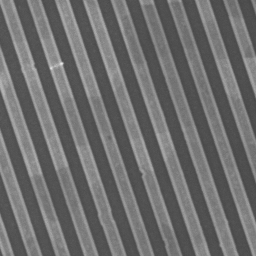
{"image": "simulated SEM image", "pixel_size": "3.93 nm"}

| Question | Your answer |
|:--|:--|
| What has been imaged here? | parallel lines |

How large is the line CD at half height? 46.7 nm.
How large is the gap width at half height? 60.6 nm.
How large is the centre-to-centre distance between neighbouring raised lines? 0.105 um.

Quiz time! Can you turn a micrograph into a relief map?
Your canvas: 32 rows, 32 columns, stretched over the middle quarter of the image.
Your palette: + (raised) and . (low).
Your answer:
...++++....+++...+++.....++.....
....+++....+++....+++....+++....
....+++....+++....+++....+++....
+...++++...++++...+++.....+++...
+....+++....+++....+++....+++...
+....+++....+++....+++....+++...
++...++++...++++....++.....+++..
++....+++....+++....+++....+++..
++....+++....+++....+++....+++..
+++...++++...++++...+++.....++..
+++....+++....+++....+++....+++.
+++....+++....+++....+++....+++.
++++...++++...++++....++.....++.
.+++....+++....+++....+++....+++
.+++....+++....+++....+++....+++
.++++...++++...++++....++.....++
..+++....+++....+++....+++....++
..+++....+++....+++....+++....++
..++++...++++...++++....++.....+
...+++....+++....+++....+++....+
...+++....+++....+++....+++....+
...++++...++++...++++...+++.....
....+++....+++....+++....+++....
....+++....+++....+++....+++....
+...++++...++++...++++....++....
+....+++....+++....+++....+++...
+....+++....+++....+++....+++...
+....++++...++++....+++....++...
++....+++....+++....+++....+++..
++....+++....+++....+++....+++..
++....++++...++++...++++....++..
+++....+++....+++....+++....+++.